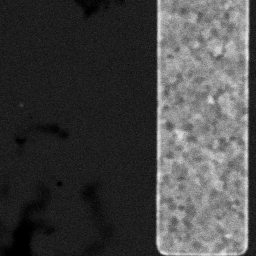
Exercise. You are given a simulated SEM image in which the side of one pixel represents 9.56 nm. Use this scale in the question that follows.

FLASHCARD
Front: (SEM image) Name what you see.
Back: wiring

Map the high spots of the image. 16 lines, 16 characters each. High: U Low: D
DDDDDDDDDDUUUUUU
DDDDDDDDDDUUUUUU
DDDDDDDDDDUUUUUU
DDDDDDDDDDUUUUUD
DDDDDDDDDDUUUUUD
DDDDDDDDDDUUUUUD
DDDDDDDDDDUUUUUD
DDDDDDDDDDUUUUUD
DDDDDDDDDDUUUUUD
DDDDDDDDDDUUUUUD
DDDDDDDDDDUUUUUD
DDDDDDDDDDUUUUUD
DDDDDDDDDDUUUUUD
DDDDDDDDDDUUUUUD
DDDDDDDDDDUUUUUD
DDDDDDDDDDUUUUUD